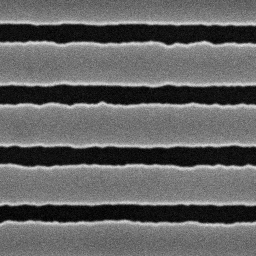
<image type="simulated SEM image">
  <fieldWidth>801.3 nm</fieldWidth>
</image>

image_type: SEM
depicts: lines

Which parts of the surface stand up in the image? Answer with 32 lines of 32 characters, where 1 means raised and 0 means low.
11111111111111111111111111111111
11111111111111111111111111111111
11111111111111111111111111111111
00000000000000000000000000000000
00000000000000000000000000000000
11111110111111111111001011001100
11111111111111111111111111111111
11111111111111111111111111111111
11111111111111111111111111111111
11111111111111111111111111111111
11111111111111111111111111111111
00000000000000000000000000000000
00000000000000000000000000000000
11111111111111111111111111111111
11111111111111111111111111111111
11111111111111111111111111111111
11111111111111111111111111111111
11111111111111111111111111111111
00000000000000000000000000000000
00000000000000000000000000000000
00000000000000000000000000000000
11111111111111111111111111111111
11111111111111111111111111111111
11111111111111111111111111111111
11111111111111111111111111111111
11111111111110100111111111111111
00000000000000000000000000000000
00000000000000000000000000000000
11111111111111111111111111111111
11111111111111111111111111111111
11111111111111111111111111111111
11111111111111111111111111111111